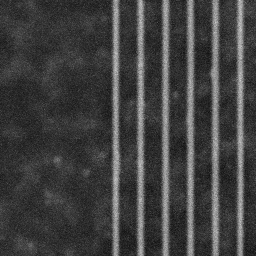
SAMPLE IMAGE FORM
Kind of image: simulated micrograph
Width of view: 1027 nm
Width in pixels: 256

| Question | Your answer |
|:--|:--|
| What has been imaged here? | parallel lines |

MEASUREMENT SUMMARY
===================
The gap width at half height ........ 80.2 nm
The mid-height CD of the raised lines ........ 20.1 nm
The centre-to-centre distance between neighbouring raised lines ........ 99.8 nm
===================